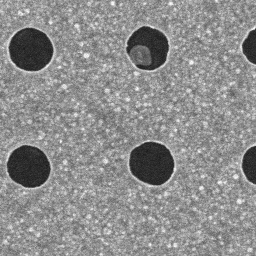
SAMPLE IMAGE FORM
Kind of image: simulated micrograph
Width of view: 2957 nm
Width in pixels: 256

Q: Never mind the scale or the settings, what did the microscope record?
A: holes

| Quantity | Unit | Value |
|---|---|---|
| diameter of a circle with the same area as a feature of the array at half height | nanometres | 504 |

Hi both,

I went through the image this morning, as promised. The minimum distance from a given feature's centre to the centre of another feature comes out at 1.34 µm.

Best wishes